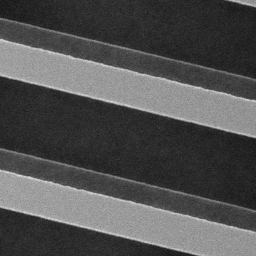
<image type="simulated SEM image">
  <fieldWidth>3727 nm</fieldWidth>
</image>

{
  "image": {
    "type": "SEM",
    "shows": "lines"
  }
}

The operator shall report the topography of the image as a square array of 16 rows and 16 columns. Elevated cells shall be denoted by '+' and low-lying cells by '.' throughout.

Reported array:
................
++..............
++++++..........
++++++++++......
++++++++++++++..
...+++++++++++++
.......+++++++++
...........+++++
...............+
+...............
+++++...........
+++++++++.......
+++++++++++++...
..++++++++++++++
......++++++++++
..........++++++